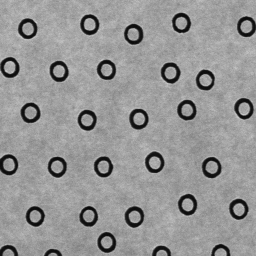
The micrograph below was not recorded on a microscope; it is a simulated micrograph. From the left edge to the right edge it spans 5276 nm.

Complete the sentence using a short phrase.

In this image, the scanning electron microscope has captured a regular array of ring-shaped grooves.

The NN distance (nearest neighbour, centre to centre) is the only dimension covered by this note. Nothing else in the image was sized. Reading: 942 nm